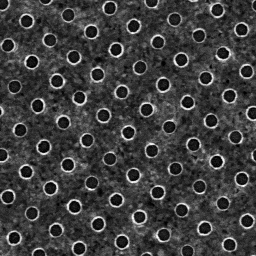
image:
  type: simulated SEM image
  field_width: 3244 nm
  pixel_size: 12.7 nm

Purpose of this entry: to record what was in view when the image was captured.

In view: a regular array of holes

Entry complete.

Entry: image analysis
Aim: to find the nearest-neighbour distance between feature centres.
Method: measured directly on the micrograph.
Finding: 370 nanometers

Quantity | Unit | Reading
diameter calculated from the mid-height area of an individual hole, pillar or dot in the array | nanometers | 157